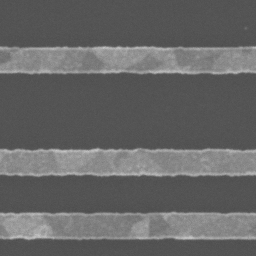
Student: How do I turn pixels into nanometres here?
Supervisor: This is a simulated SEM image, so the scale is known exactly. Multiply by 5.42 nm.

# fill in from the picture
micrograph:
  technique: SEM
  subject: lines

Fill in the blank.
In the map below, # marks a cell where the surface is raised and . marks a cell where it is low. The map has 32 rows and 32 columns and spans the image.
................................
................................
................................
................................
................................
................................
################################
################################
################################
................................
................................
................................
................................
................................
................................
................................
................................
................................
................................
################################
################################
################################
................................
................................
................................
................................
................................
################################
################################
################################
................................
................................